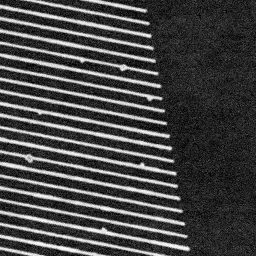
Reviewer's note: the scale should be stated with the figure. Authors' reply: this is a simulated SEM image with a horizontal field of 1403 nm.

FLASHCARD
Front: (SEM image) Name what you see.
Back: parallel lines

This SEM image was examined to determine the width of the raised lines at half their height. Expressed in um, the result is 0.0168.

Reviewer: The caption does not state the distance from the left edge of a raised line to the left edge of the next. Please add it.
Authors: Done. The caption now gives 65 nanometres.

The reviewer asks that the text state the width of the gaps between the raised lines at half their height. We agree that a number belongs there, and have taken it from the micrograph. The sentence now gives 50.5 nanometers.